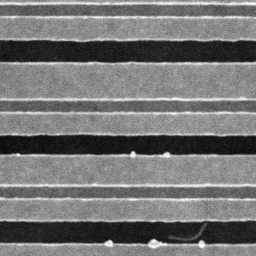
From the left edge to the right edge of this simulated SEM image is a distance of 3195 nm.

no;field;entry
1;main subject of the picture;lines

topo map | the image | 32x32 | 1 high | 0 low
11111111111111111111111111111111
11111111111111111111111111111111
11111111111111111111111111111111
11111111111111111111111111111111
11111111111111111111111111111111
00000000000000000000000000000000
00000000000000000000000000000000
00000000000000000000000000000000
11111111111111111111111111111111
11111111111111111111111111111111
11111111111111111111111111111111
11111111111111111111111111111111
11111111111111111111111111111111
11111111111111111111111111111111
11111111111111111111111111111111
11111111111111111111111111111111
11111111111111111111111111111111
00000000000000000000000000000000
00000000000000000000000000000000
11111111111111111111111111111111
11111111111111111111111111111111
11111111111111111111111111111111
11111111111111111111111111111111
11111111111111111111111111111111
11111111111111111111111111111111
11111111111111111111111111111111
11111111111111111111111111111111
11111111111111111111111111111110
00000000000000000000000000000000
00000000000000000000000000000000
01000000111001100011100011000000
11111111111111111111111111111111